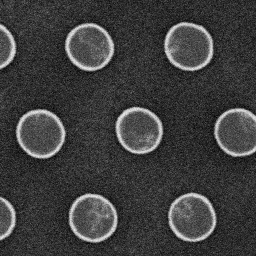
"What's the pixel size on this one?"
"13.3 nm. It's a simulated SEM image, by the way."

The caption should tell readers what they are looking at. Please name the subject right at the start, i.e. raised bodies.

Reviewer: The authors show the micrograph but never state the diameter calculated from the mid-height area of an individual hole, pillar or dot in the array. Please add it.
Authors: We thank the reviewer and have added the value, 612 nm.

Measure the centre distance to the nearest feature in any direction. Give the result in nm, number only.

1310